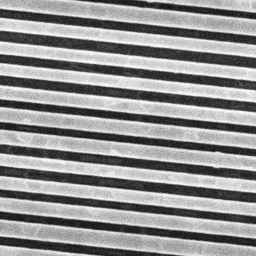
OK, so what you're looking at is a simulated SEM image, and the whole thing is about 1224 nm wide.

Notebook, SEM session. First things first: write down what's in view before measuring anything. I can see parallel lines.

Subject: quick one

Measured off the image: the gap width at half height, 9.44 px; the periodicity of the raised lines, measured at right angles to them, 22.6 px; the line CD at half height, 58.8 nm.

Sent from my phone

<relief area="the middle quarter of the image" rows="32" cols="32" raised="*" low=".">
...............*****************
......................**********
********........................
*****************...............
..*************************.....
...........*********************
....................************
*.............................**
************....................
*********************...........
..****************************..
............********************
.....................***********
*********.....................**
******************..............
***************************.....
.....***************************
..............******************
**......................********
***********.....................
*********************...........
.*****************************..
..........**********************
..................**************
***..........................***
************....................
*********************...........
......*************************.
...............*****************
.......................*********
*****...........................
***************.................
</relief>